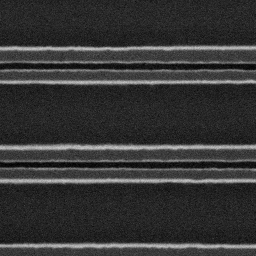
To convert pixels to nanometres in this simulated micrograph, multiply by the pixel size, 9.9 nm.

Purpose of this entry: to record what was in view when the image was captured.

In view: lines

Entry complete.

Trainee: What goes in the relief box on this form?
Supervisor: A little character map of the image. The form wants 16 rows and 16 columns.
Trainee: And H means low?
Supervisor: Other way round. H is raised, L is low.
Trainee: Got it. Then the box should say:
LLLLLLLLLLLLLLLL
LLLLLLLLLLLLLLLL
LLLLLLLLLLLLLLLL
HHHHHHHHHHHHHHHH
HHHHHHHHHHHHHHHH
LLLLLLLLLLLLLLLL
LLLLLLLLLLLLLLLL
LLLLLLLLLLLLLLLL
LLLLLLLLLLLLLLLL
HHHHHHHHHHHHHHHH
HHHHHHHHHHHHHHHH
LLLLLLLLLLLLLLLL
LLLLLLLLLLLLLLLL
LLLLLLLLLLLLLLLL
LLLLLLLLLLLLLLLL
HHHHHHHHHHHHHHHH